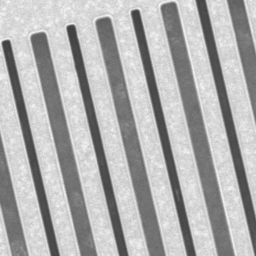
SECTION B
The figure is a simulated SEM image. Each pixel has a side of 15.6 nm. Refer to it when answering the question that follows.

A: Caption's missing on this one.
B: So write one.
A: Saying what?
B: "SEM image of parallel lines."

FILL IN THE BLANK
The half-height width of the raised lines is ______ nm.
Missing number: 323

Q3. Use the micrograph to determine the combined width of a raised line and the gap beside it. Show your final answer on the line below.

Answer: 33.1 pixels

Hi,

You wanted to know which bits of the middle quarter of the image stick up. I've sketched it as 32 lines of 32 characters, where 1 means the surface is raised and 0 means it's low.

11100111110000011111001111100000
11100111110000011111001111110000
11100011111000011111000111110000
11110011111000011111100111110000
11110011111000011111100111110000
11110011111000001111100111110000
11110001111100001111100111111000
11110001111100001111100011111000
11111001111100001111110011111000
11111001111100000111110011111000
11111001111100000111110011111100
11111000111110000111110001111100
11111000111110000111111001111100
11111100111110000011111001111100
01111100111110000011111001111110
01111100011111000011111000111110
01111100011111000011111100111110
01111110011111000001111100111110
00111110011111000001111100111110
00111110001111100001111100111111
00111110001111100001111100011111
00111111001111100001111110011111
00011111001111100000111110011111
00011111001111100000111110011111
00011111000111110000111110001111
00011111000111110000111111001111
00011111100111110000011111001111
00001111100111110000011111001111
00001111100011111000011111000111
00001111100011111000011111100111
00001111110011111000001111100111
00000111110011111000001111100111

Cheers